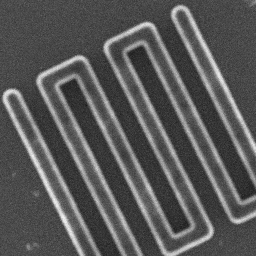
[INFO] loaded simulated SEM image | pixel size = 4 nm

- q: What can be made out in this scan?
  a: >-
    groups of lines, slits or small figures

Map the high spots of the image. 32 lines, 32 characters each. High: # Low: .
................................
......................#.........
......................##........
.................##...##........
...............#####...##.......
.............#######...##.......
.............###...##...##......
.........##...##...##...##......
.......####...###...##...##.....
.....#######...##...##...##.....
.....###..##...###...##...##....
.#...##....##...##...##...##....
.##...##...##...##...###...##...
.##...###...##...##...##...##...
..##...##...##...##...###...##..
..##...###...##...##...##...##..
..###...##...##...##...###...##.
...##...##....##...##...##...##.
....##...##...##...##...###...##
....##...##....##...##...##...##
.....##...##...##...##...###...#
.....##...##....##...##...##...#
......##...##...##...##...###...
......##...##....##...##...##...
......###...##...##...##...###..
.......##...##...###...##...####
.......###...##...##...##...####
........##...##...###...##...##.
........###...##...##...##......
.........##...###..#######......
.........###...##...####........
..........##...##....#..........